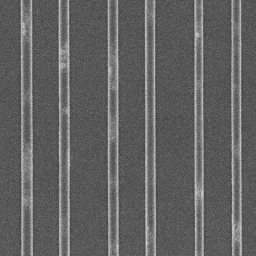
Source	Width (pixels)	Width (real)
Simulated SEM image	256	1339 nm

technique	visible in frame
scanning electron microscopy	parallel lines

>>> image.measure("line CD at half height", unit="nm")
53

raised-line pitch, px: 42